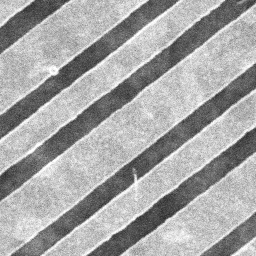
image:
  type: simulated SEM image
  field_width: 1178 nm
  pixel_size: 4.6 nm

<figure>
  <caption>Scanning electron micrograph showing lines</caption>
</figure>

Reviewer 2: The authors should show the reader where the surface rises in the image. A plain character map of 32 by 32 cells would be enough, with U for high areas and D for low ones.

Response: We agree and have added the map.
UUUUDDDDUUUUUUUUUUDDDDUUUUUUDDDD
UUDDDDDUUUUUUUUUDDDDDUUUUUDDDDDU
UDDDDDUUUUUUUUUDDDDUUUUUUDDDDUUU
DDDDUUUUUUUUUUDDDDUUUUUUDDDDUUUU
DDDUUUUUUUUUUDDDDUUUUUDDDDDUUUUU
DDUUUUUUUUUDDDDDUUUUUDDDDUUUUUUU
UUUUUUUUUUDDDDUUUUUUDDDDUUUUUUUU
UUUUUUUUUDDDDUUUUUUDDDDUUUUUUUUU
UUUUUUUUDDDDUUUUUDDDDDUUUUUUUUUD
UUUUUUDDDDUUUUUUDDDDUUUUUUUUUUDD
UUUUUDDDDUUUUUUDDDDUUUUUUUUUUDDD
UUUUDDDDUUUUUUDDDDUUUUUUUUUDDDDD
UUDDDDUUUUUUDDDDDUUUUUUUUUDDDDUU
UDDDDUUUUUUDDDDUUUUUUUUUUDDDDUUU
DDDDUUUUUUDDDDUUUUUUUUUDDDDDUUUU
DDDUUUUUDDDDDUUUUUUUUUDDDDUUUUUU
DUUUUUUDDDDUUUUUUUUUUDDDDUUUUUUD
UUUUUUDDDDUUUUUUUUUUDDDDUUUUUUDD
UUUUUDDDDUUUUUUUUUDDDDDUUUUUDDDD
UUUDDDDUUUUUUUUUUDDDDUUUUUUDDDDU
UUDDDDUUUUUUUUUUDDDDUUUUUUDDDDUU
DDDDDUUUUUUUUUDDDDDUUUUUDDDDDUUU
DDDDUUUUUUUUUDDDDUUUUUUDDDDDUUUU
DDUUUUUUUUUUDDDDUUUUUUDDDDUUUUUU
DUUUUUUUUUUDDDDUUUUUDDDDDUUUUUUU
UUUUUUUUUDDDDUUUUUUDDDDDUUUUUUUU
UUUUUUUUDDDDUUUUUUDDDDUUUUUUUUUU
UUUUUUUDDDDUUUUUUDDDDUUUUUUUUUUD
UUUUUUDDDDUUUUUDDDDDUUUUUUUUUDDD
UUUUDDDDUUUUUUDDDDUUUUUUUUUUDDDD
UUUDDDDUUUUUUDDDDUUUUUUUUUUDDDDU
UUDDDDUUUUUDDDDDUUUUUUUUUDDDDDUU